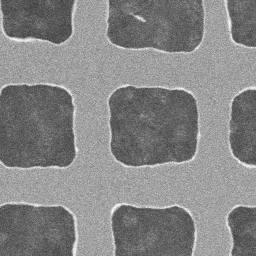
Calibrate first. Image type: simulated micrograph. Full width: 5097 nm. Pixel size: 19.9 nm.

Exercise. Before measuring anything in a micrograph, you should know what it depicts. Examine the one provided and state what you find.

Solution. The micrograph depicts holes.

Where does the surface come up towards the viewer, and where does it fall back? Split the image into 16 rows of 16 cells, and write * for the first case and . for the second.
.....**......*..
.....**......*..
***.***......**.
****************
****************
....****..******
.....**.....***.
.....**.....**..
.....**.....**..
.....**.....***.
*.**************
****************
****************
....***.....**..
.....**.....**..
.....**.....***.